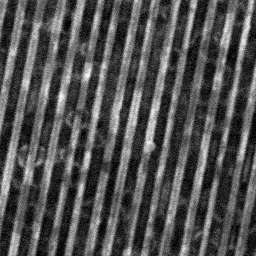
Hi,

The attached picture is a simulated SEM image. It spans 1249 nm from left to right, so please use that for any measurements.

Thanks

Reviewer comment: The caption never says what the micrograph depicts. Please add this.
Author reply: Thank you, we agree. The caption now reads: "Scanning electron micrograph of parallel lines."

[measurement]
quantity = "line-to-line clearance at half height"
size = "61.1 nm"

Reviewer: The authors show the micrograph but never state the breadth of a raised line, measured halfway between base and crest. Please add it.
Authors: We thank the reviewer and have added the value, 32.9 nm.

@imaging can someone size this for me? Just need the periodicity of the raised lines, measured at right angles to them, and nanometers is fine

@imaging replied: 91.1